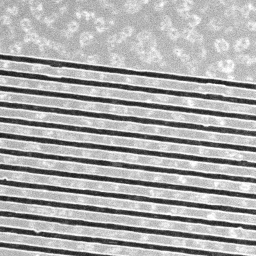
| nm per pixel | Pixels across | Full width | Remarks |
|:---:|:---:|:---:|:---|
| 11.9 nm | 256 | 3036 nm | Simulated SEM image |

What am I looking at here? parallel lines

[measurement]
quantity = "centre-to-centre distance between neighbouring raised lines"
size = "0.184 um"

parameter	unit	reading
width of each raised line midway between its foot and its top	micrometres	0.122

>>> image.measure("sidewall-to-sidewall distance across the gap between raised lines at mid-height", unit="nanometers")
66.2